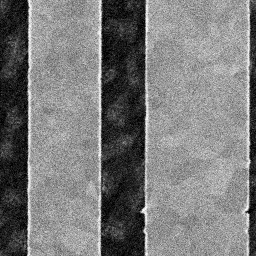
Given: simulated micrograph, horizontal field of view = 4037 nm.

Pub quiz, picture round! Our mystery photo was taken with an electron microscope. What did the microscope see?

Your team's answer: one or a few lines or trenches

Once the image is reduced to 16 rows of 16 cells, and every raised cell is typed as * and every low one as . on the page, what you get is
..****...*******
..****...*******
..****...*******
..****...*******
..****...*******
..****...*******
..****...******.
..****...*******
..****...*******
..****...*******
..****...*******
..****...******.
..****...******.
..****...******.
..****...******.
..****...******.